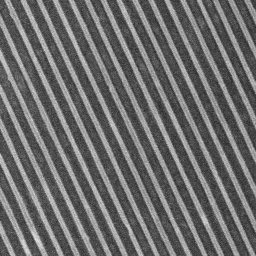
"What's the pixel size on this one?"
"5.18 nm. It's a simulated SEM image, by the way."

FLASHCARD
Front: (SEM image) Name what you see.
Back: parallel lines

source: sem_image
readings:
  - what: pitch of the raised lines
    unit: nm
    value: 75.2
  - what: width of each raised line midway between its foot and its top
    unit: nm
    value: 22.9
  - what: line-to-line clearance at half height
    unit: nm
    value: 55.8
